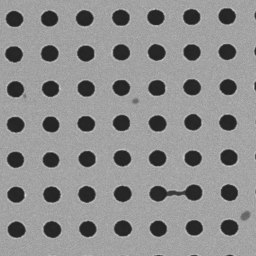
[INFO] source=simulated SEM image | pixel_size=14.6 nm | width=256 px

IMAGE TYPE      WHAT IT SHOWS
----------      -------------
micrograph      a regular array of holes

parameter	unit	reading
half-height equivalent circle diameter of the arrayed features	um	0.249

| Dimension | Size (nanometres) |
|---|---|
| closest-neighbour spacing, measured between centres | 511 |